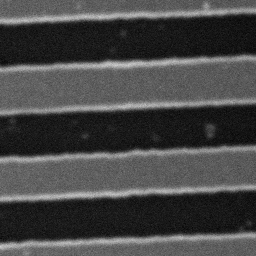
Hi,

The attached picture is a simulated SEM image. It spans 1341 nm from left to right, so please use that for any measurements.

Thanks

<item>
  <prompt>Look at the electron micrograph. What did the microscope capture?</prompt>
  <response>lines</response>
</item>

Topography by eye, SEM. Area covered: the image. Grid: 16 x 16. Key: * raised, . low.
****************
................
................
................
****************
****************
**************..
................
................
........********
****************
****************
**..............
................
................
****************